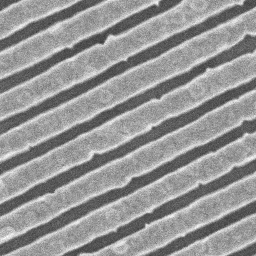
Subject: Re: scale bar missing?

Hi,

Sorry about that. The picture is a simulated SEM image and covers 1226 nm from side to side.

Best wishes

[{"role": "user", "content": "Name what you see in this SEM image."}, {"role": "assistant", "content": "parallel lines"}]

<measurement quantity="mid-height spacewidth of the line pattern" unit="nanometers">57.9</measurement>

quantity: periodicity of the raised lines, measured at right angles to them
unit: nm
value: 176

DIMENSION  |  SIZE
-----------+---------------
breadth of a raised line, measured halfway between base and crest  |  116 nanometres